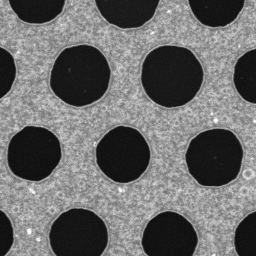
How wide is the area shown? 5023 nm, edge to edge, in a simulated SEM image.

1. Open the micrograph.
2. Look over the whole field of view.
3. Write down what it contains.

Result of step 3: holes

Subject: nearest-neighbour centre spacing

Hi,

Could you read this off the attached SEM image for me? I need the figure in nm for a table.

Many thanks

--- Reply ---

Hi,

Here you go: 1760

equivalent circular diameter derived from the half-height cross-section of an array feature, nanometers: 1140